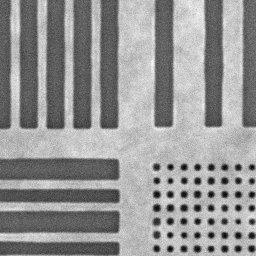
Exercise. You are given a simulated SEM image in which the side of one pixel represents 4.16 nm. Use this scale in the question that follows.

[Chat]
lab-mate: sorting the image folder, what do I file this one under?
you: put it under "groups of lines, slits or small figures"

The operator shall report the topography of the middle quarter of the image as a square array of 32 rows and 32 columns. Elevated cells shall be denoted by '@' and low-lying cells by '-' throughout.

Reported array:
-@-----@@-----@@@@@@@@------@@@@
-@-----@@-----@@@@@@@@-----@@@@@
-@-----@@-----@@@@@@@@-----@@@@@
@@-----@@-----@@@@@@@@------@@@@
@@-----@@-----@@@@@@@@@-----@@@@
@@-----@@-----@@@@@@@@@-----@@@@
@@-----@@-----@@@@@@@@@----@@@@@
-@-----@@-----@@@@@@@@@----@@@@@
-@-----@@-----@@@@@@@@-----@@@@@
-@-----@@-----@@@@@@@@------@@@@
-@-----@@-----@@@@@@@@------@@@@
-@-----@@-----@@@@@@@@------@@@@
@@-----@@-----@@@@@@@@------@@@@
@@-----@@-----@@@@@@@@------@@@@
@@-----@@-----@@@@@@@@------@@@@
@@-----@@-----@@@@@@@@@----@@@@@
@@@@@@@@@@@@@@@@@@@@@@@@@@@@@@@@
@@@@@@@@@@@@@@@@@@@@@@@@@@@@@@@@
@@@@@@@@@@@@@@@@@@@@@@@@@@@@@@@@
@@@@@@@@@@@@@@@@@@@@@@@@@@@@@@@@
@@@@@@@@@@@@@@@@@@@@@@@@@@@@@@@@
@@@@@@@@@@@@@@@@@@@@@@@@@@@@@@@@
@@@@@@@@@@@@@@@@@@@@@@@@@@@@@@@@
-------------@@@@@@@@@@@@@@@@@@@
--------------@@@@@@@@@@@@@@@@@@
--------------@@@@@@@@--@@-@@--@
--------------@@@@@@@@--@@-@@--@
--------------@@@@@@@@@@@@@@@@@@
--------------@@@@@@@@@-@@-@@@@@
@@@@@@@@@@@@@@@@@@@@@@--@@-@@--@
@@@@@@@@@@@@@@@@@@@@@@@@@@@@@@@@
--------------@@@@@@@@@@@@@@@@@@